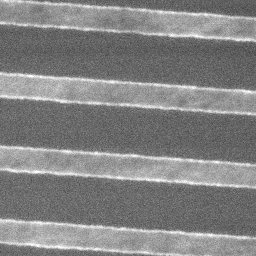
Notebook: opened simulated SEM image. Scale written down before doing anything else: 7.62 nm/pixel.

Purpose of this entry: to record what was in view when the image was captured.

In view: lines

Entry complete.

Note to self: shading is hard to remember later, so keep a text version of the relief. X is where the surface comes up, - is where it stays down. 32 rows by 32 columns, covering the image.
XXXXXXX-------------------------
XXXXXXXXXXXXXXXXXXXXX-----------
XXXXXXXXXXXXXXXXXXXXXXXXXXXXXXXX
---------XXXXXXXXXXXXXXXXXXXXXXX
------------------------XXXXXXXX
--------------------------------
--------------------------------
--------------------------------
--------------------------------
XXXX----------------------------
XXXXXXXXXXXXXXXXXX--------------
XXXXXXXXXXXXXXXXXXXXXXXXXXXXXXXX
-----XXXXXXXXXXXXXXXXXXXXXXXXXXX
--------------------XXXXXXXXXXXX
--------------------------------
--------------------------------
--------------------------------
--------------------------------
XXX-----------------------------
XXXXXXXXXXXXXXXXXX--------------
XXXXXXXXXXXXXXXXXXXXXXXXXXXXXX--
---XXXXXXXXXXXXXXXXXXXXXXXXXXXXX
------------------XXXXXXXXXXXXXX
--------------------------------
--------------------------------
--------------------------------
--------------------------------
X-------------------------------
XXXXXXXXXXXXXX------------------
XXXXXXXXXXXXXXXXXXXXXXXXXXXXX---
--XXXXXXXXXXXXXXXXXXXXXXXXXXXXXX
---------------XXXXXXXXXXXXXXXXX